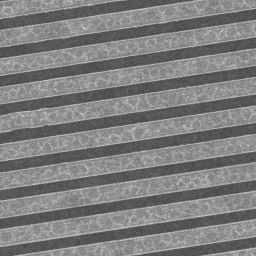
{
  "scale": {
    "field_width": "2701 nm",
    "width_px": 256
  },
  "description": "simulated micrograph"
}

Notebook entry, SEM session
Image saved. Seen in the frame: parallel lines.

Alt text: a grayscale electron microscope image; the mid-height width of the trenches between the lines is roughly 11.9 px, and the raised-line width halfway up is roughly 16.4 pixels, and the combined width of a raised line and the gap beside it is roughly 0.297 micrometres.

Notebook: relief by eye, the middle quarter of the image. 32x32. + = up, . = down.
.....................+++++++++++
.............+++++++++++++++++++
......++++++++++++++++++++++++++
++++++++++++++++++++++++++......
+++++++++++++++++++.............
+++++++++++++...................
++++++.....................+++++
....................++++++++++++
..............++++++++++++++++++
.......+++++++++++++++++++++++++
+++++++++++++++++++++++++++.....
++++++++++++++++++++............
++++++++++++++..................
+++++++......................+++
......................++++++++++
................++++++++++++++++
........++++++++++++++++++++++++
...+++++++++++++++++++++++++....
+++++++++++++++++++++...........
+++++++++++++++.................
++++++++.....................+++
+.....................++++++++++
...............+++++++++++++++++
.........+++++++++++++++++++++++
..+++++++++++++++++++++++++++...
++++++++++++++++++++++..........
+++++++++++++++.................
+++++++++.....................++
++.....................+++++++++
................++++++++++++++++
..........++++++++++++++++++++++
...+++++++++++++++++++++++++++..